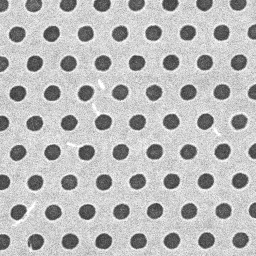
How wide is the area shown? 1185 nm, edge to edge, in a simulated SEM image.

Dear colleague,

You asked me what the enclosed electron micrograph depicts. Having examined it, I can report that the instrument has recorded a regular array of holes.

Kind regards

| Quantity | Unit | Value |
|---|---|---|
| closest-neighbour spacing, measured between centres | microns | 0.156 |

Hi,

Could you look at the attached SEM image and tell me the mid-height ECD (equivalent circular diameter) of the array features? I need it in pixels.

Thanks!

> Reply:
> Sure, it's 16.8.